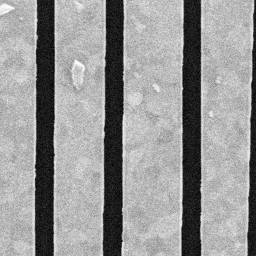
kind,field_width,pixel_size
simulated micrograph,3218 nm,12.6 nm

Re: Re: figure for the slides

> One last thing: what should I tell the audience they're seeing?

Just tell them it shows lines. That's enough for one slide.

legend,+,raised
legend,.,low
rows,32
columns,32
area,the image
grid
+++++..++++++...+++++++..+++++++
+++++..++++++...+++++++..+++++++
+++++..++++++...+++++++..+++++++
++++...++++++...+++++++..+++++++
++++...++++++...+++++++..+++++++
++++...++++++...+++++++..+++++++
++++...++++++...+++++++..++++++.
++++...++++++...+++++++..++++++.
++++...++++++...+++++++..++++++.
++++...++++++...+++++++..++++++.
++++...++++++...+++++++..++++++.
++++...++++++...+++++++..++++++.
++++...++++++...+++++++..++++++.
++++...++++++...+++++++..++++++.
++++...++++++..++++++++..++++++.
++++...++++++..++++++++..++++++.
++++...++++++..++++++++..++++++.
++++...++++++..++++++++..++++++.
++++...++++++..++++++++..++++++.
++++...++++++..++++++++..++++++.
++++...++++++..++++++++..++++++.
++++...++++++..++++++++..++++++.
++++...++++++..++++++++..++++++.
++++...++++++..++++++++..++++++.
++++...++++++..++++++++..++++++.
++++...++++++..++++++++..++++++.
++++...++++++..++++++++..++++++.
++++...++++++..++++++++..++++++.
++++...++++++..++++++++..++++++.
++++...++++++..++++++++..++++++.
++++...++++++..++++++++..++++++.
++++...++++++..++++++++..++++++.